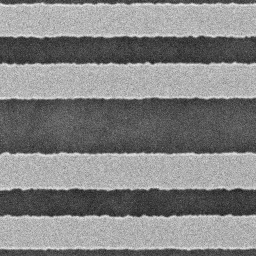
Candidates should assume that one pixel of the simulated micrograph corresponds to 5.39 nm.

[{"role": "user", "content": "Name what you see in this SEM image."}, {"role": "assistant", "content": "lines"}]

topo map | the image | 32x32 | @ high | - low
---@@@-@----@----@@@@-@--@-@-@-@
@@@@@@@@@@@@@@@@@@@@@@@@@@@@@@@@
@@@@@@@@@@@@@@@@@@@@@@@@@@@@@@@@
@@@@@@@@@@@@@@@@@@@@@@@@@@@@@@@@
@@@@@@@@@@@@@@@@@@@@@@@@@@@@@@@@
--------------------------------
--------------------------------
--------------------------------
@@@@@@@@@@@@@@@@@@@@@@@@@@@@@@@@
@@@@@@@@@@@@@@@@@@@@@@@@@@@@@@@@
@@@@@@@@@@@@@@@@@@@@@@@@@@@@@@@@
@@@@@@@@@@@@@@@@@@@@@@@@@@@@@@@@
--------------------------------
--------------------------------
--------------------------------
--------------------------------
--------------------------------
--------------------------------
--------------------------------
@@@@@@@@@@@@@@@@@@@@@@@@@@@@@@@@
@@@@@@@@@@@@@@@@@@@@@@@@@@@@@@@@
@@@@@@@@@@@@@@@@@@@@@@@@@@@@@@@@
@@@@@@@@@@@@@@@@@@@@@@@@@@@@@@@@
@@@@@@@@@-@@@@@@@@@-@@@@@@@-@@@@
--------------------------------
--------------------------------
--------------------------------
@@@@@@@@@@@@@@@@@@@@@@@@@@@@@@@@
@@@@@@@@@@@@@@@@@@@@@@@@@@@@@@@@
@@@@@@@@@@@@@@@@@@@@@@@@@@@@@@@@
@@@@@@@@@@@@@@@@@@@@@@@@@@@@@@@@
--------------------------------